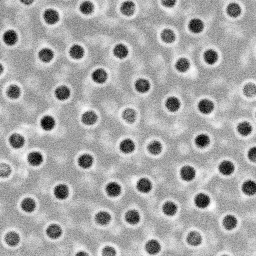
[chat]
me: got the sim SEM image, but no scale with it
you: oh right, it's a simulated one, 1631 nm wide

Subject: a regular array of holes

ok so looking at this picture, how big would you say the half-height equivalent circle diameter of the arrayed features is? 108 nanometres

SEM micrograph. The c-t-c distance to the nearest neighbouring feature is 0.21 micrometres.